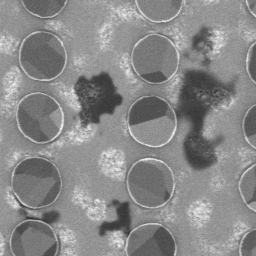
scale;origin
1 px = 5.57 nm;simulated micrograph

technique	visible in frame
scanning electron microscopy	raised bodies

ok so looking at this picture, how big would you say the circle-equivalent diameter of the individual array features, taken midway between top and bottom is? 271 nm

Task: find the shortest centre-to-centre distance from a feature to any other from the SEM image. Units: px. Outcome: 61.6